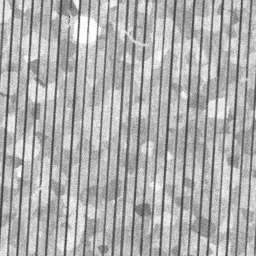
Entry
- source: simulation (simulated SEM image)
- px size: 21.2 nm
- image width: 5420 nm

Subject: parallel lines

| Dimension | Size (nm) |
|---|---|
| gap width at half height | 58.1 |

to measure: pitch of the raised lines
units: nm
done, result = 201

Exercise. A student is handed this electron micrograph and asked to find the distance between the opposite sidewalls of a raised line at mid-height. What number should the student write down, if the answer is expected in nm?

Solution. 135